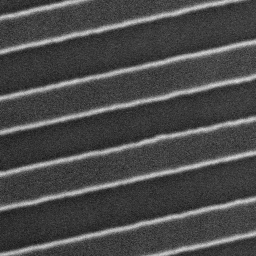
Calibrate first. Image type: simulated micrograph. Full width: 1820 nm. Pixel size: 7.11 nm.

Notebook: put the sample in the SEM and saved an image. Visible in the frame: lines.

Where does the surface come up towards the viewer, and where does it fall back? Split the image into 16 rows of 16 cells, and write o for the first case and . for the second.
..oooooooooo....
oooooooo........
oooo............
...........ooooo
.......ooooooooo
...oooooooooo...
ooooooooo.......
oooo...........o
..........oooooo
......oooooooooo
.ooooooooooo....
ooooooo.........
ooo............o
...........ooooo
......oooooooooo
..oooooooooo....